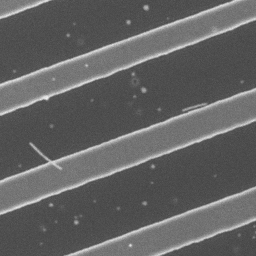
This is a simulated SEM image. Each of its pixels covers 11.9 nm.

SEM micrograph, lines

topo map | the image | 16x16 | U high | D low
UUDDDDDDDDDDDUUU
DDDDDDDDDDUUUUUD
DDDDDDDDUUUUUDDD
DDDDDUUUUUDDDDDD
DDUUUUUDDDDDDDDD
UUUUUDDDDDDDDDDD
UUDDDDDDDDDDDUUU
DDDDDDDDDDUUUUUU
DDDDDDDDUUUUUDDD
DDDDDUUUUUUDDDDD
DDUUUUUUDDDDDDDD
UUUUUDDDDDDDDDDD
UUDDDDDDDDDDDDUU
DDDDDDDDDDDUUUUU
DDDDDDDDUUUUUUDD
DDDDDUUUUUUDDDDD